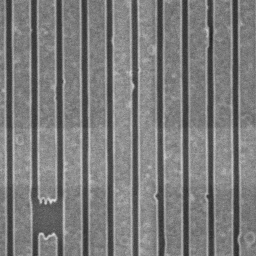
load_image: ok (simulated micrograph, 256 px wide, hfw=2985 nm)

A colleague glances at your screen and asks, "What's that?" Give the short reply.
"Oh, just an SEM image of parallel lines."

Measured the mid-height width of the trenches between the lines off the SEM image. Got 0.0772 microns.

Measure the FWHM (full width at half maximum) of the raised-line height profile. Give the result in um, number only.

0.219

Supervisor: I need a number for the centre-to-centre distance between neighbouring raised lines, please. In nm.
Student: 293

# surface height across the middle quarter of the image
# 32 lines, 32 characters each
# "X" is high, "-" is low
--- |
XXXX--XXXXX-XXXXX--XXXX--XXXX--X
XXXX--XXXXX-XXXXX--XXXX--XXXX--X
XXXX--XXXXX-XXXXX--XXXX--XXXX--X
XXXX--XXXXX-XXXXX--XXXX--XXXX--X
XXXX--XXXXX-XXXXX--XXXX--XXXX--X
XXXX--XXXXX-XXXXX--XXXX--XXXX--X
XXXX--XXXXX--XXXX--XXXX--XXXX--X
XXXX--XXXXX--XXXX--XXXX--XXXX--X
XXXX--XXXXX--XXXX--XXXX--XXXX--X
XXXX--XXXXX--XXXX--XXXX--XXXX--X
XXXX--XXXXX--XXXX--XXXX--XXXX--X
XXXX--XXXXX--XXXX--XXXX--XXXX--X
XXXX--XXXXX--XXXX--XXXX--XXXX--X
XXXX--XXXXX--XXXX--XXXX--XXXX--X
XXXX--XXXXX--XXXX--XXXX--XXXX--X
XXXX--XXXXX--XXXX--XXXX--XXXX--X
XXXX--XXXXX--XXXX--XXXX--XXXX--X
XXXX--XXXXX--XXXX--XXXX--XXXX--X
XXXX--XXXX---XXXX--XXXX--XXXX--X
XXXX--XXXX---XXXX--XXXX--XXXX--X
XXXX--XXXX---XXXX--XXXX--XXXX--X
XXXX--XXXX---XXXX--XXXX--XXXX--X
XXXX--XXXXX--XXXX--XXXX--XXXX--X
XXXX--XXXXX--XXXX--XXXX--XXXX--X
XXXX--XXXXX--XXXX--XXXX--XXXX--X
XXXX--XXXXX--XXXX--XXXX--XXXX--X
XXXX--XXXXX--XXXX--XXXX--XXXX--X
XXXX--XXXXX--XXXX--XXXX--XXXX--X
XXXX--XXXXX--XXXX--XXXX--XXXX--X
XXXX--XXXXX--XXXX--XXXX--XXXX--X
XXXX--XXXXX--XXXX--XXXX--XXXX--X
XXXX--XXXXX--XXXX--XXXX--XXXX--X